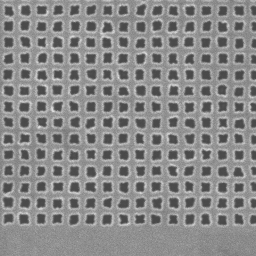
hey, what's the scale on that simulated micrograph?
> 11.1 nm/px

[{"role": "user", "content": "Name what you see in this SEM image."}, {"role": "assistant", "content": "a regular array of holes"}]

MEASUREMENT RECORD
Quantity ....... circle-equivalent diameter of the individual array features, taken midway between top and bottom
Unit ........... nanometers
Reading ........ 111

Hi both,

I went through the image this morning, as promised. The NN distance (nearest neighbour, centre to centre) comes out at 0.172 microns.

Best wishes